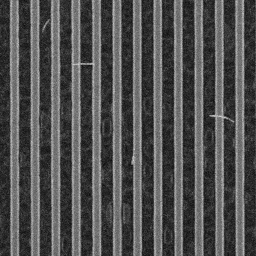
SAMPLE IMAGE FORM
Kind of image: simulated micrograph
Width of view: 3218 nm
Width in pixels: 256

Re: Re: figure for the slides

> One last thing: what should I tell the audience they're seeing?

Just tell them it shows parallel lines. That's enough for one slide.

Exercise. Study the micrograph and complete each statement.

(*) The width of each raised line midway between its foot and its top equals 86.4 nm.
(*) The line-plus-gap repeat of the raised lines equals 258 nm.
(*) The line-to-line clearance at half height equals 162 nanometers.